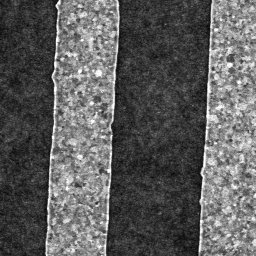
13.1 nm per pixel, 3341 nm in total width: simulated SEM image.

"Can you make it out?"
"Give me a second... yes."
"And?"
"one or a few lines or trenches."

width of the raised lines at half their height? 60.1 pixels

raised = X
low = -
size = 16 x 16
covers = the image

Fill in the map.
----XXX------XXX
----XXX------XXX
----XXX------XXX
---XXXX------XXX
---XXXX------XXX
---XXXX------XXX
---XXXX------XXX
---XXXX------XXX
---XXXX------XXX
---XXXX------XXX
---XXXX------XXX
---XXXX------XXX
---XXXX------XXX
---XXXX------XXX
---XXXX------XXX
---XXXX-----XXXX